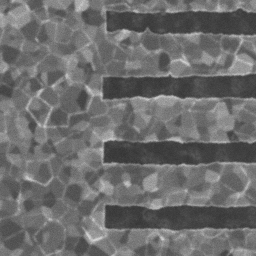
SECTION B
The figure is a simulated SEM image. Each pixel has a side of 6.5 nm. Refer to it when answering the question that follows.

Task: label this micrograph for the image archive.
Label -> one or a few lines or trenches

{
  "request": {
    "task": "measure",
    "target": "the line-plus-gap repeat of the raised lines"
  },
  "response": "420 nm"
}